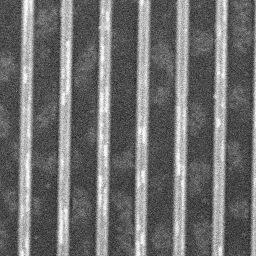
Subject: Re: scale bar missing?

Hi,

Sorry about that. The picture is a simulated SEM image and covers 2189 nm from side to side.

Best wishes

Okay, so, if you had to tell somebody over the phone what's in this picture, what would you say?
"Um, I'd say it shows parallel lines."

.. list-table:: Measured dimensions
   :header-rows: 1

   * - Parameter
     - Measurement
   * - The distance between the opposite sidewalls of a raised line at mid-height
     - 94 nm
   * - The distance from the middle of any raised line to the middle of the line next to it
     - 38.8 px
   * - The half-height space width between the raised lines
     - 243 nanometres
